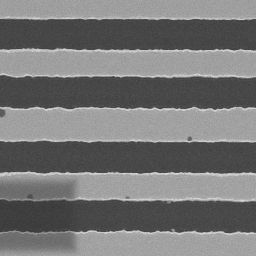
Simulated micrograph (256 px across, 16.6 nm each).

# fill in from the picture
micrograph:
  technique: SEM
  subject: lines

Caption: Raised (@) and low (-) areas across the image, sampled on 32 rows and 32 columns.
@@@@@@@@@@@@@@@@@@@@@@@@@@@@@@@@
@@@@@@@@@@@@@@@@@@@@@@@@@@@@@@@@
--------------------------------
--------------------------------
--------------------------------
--------------------------------
@@@@@@@@@@@@@@@@@@@@@@@@@@@@@@@@
@@@@@@@@@@@@@@@@@@@@@@@@@@@@@@@@
@@@@@@@@@@@@@@@@@@@@@@@@@@@@@@@@
-@@----@@--@---@-@@@@@@@--@@@@@@
--------------------------------
--------------------------------
--------------------------------
@@--@-@@--@@@@@--@------@----@@@
@@@@@@@@@@@@@@@@@@@@@@@@@@@@@@@@
@@@@@@@@@@@@@@@@@@@@@@@@@@@@@@@@
@@@@@@@@@@@@@@@@@@@@@@@@@@@@@@@@
@@@@@@@@@@@@@@@@@@@@@@@@@@@@@@@@
--------------------------------
--------------------------------
--------------------------------
---@----------------------------
@@@@@@@@@@@@@@@@@@@@@@@@@@@@@@@@
@@@@@@@@@@@@@@@@@@@@@@@@@@@@@@@@
@@@@@@@@@@@@@@@@@@@@@@@@@@@@@@@@
--------------------------------
--------------------------------
--------------------------------
--------------------------------
@@@@@@@@@@@@@@@@@@@@@@@@@@@@@@@@
@@@@@@@@@@@@@@@@@@@@@@@@@@@@@@@@
@@@@@@@@@@@@@@@@@@@@@@@@@@@@@@@@